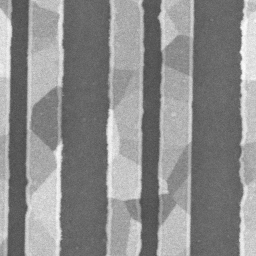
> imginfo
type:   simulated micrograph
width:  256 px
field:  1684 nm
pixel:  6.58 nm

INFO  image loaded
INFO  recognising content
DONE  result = one or a few lines or trenches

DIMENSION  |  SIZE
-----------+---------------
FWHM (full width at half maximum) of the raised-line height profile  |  198 nanometres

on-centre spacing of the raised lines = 433 nanometers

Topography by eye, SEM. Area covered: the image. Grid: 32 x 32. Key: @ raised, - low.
@---@@@@------@@@@--@@@@-------@
@---@@@@------@@@@--@@@@-------@
@---@@@@------@@@@--@@@@-------@
@---@@@@------@@@@--@@@@------@@
@---@@@@------@@@@--@@@@------@@
@---@@@@------@@@@--@@@@------@@
@---@@@@------@@@@--@@@@------@@
@---@@@@------@@@@--@@@@------@@
@---@@@@------@@@@--@@@@-------@
@---@@@@------@@@@--@@@@------@@
@---@@@-------@@@@--@@@@------@@
@---@@@-------@@@@--@@@@------@@
@---@@@@------@@@@--@@@@------@@
@---@@@-------@@@@--@@@@------@@
@---@@@-------@@@@--@@@@------@@
@---@@@-------@@@@--@@@@-------@
@---@@@-------@@@@--@@@@-------@
@---@@@-------@@@@--@@@@------@@
@---@@@-------@@@@--@@@@------@@
@---@@@-------@@@---@@@@------@@
@--@@@@-------@@@---@@@@------@@
@---@@@-------@@@@--@@@@------@@
@---@@@-------@@@---@@@@------@@
@--@@@@-------@@@@--@@@@-------@
@--@@@@-------@@@---@@@@-------@
@---@@@-------@@@---@@@@------@@
@---@@@-------@@@---@@@@------@@
@--@@@@-------@@@---@@@@------@@
@--@@@@-------@@@---@@@@------@@
@--@@@@-------@@@---@@@@------@@
@--@@@@-------@@@---@@@@------@@
@--@@@@-------@@@---@@@-------@@